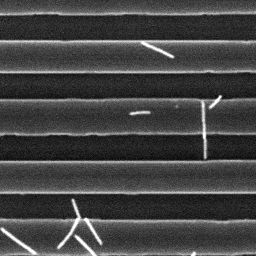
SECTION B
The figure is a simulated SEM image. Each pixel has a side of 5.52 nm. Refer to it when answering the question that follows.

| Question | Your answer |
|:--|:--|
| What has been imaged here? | lines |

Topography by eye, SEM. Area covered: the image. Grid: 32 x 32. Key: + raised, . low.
++++++++++++++++++++++++++++++++
++++++++++++++++++++++++++++++++
................................
................................
................................
++++++++++++++++++++++++++++++++
++++++++++++++++++++++++++++++++
++++++++++++++++++++++++++++++++
++++++++++++++++++++++++++++++++
................................
................................
................................
...............++++++++++..+...+
++++++++++++++++++++++++++++++++
++++++++++++++++++++++++++++++++
++++++++++++++++++++++++++++++++
++++++++++++++++++++++++++++++++
................................
................................
................................
++++++++++++++++++++++++++++++++
++++++++++++++++++++++++++++++++
++++++++++++++++++++++++++++++++
++++++++++++++++++++++++++++++++
................................
................................
................................
++.......+++....................
++++++++++++++++++++++++++++++++
++++++++++++++++++++++++++++++++
++++++++++++++++++++++++++++++++
++++++++++++++++++++++++++++++++